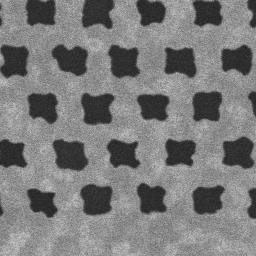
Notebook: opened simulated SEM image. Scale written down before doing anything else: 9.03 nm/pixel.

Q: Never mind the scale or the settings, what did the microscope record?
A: a regular array of holes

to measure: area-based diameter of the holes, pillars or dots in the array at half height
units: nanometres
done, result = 280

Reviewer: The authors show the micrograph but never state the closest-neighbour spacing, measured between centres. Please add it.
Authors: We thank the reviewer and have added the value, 0.477 µm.